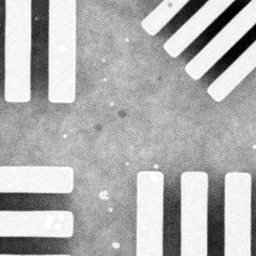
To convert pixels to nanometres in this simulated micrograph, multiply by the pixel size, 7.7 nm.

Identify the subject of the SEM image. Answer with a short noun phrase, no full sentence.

groups of lines, slits or small figures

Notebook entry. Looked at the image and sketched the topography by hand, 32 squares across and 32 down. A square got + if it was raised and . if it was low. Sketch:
.+++..+++...........+++...+++..+
.+++..+++..........+++...+++..++
.+++..+++.........+++...+++..+++
.+++..+++.........++...+++..+++.
.+++..+++.............+++..+++..
.+++..+++............+++..+++...
.+++..+++............++..+++...+
.+++..+++...............+++...++
.+++..+++..............+++...+++
.+++..+++...............+...+++.
.+++..+++..................+++..
.+++..+++.................+++...
.++...+++.......................
................................
................................
................................
................................
................................
................................
................................
................................
+++++++++.......................
+++++++++........+++...+++..+++.
+++++++++........+++...+++..+++.
.................+++...+++..+++.
.................+++...+++..+++.
+++++++++........+++...+++..+++.
+++++++++........+++...+++..+++.
+++++++++........+++...+++..+++.
.....++++........+++...+++..+++.
.................+++...+++..+++.
.................+++...+++..+++.